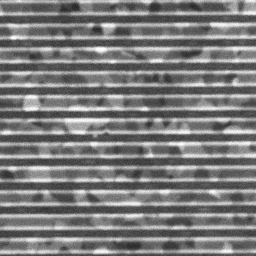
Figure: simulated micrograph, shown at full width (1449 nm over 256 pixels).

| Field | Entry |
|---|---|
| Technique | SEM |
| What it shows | parallel lines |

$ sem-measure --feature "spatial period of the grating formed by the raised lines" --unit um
0.135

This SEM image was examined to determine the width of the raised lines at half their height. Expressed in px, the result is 13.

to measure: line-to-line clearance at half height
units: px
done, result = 10.9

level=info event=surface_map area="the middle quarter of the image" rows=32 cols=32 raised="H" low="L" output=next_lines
LLLLLLLLLLLLLLLLLLLLLLLLLLLLLLLL
LLLLLLLLLLLLLLLLLLLLLLLLLLLLLLLL
HHHHHHHHHHHHHHHHHHHHHHHHHHHHHHHH
HHHHHHHHHHHHHHHHHHHHHHHHHHHHHHHH
HHHHHHHHHHHHHHHHHHHHHHHHHHHHHHHH
LLLLLLLLLLLLLLLLLLLLLLLLLLLLLLLL
LLLLLLLLLLLLLLLLLLLLLLLLLLLLLLLL
LLLLLLLLLLLLLLLLLLLLLLLLLLLLLLLL
HHHHHHHHHHHHHHHHHHHHHHHHHHHHHHHH
HHHHHHHHHHHHHHHHHHHHHHHHHHHHHHHH
HHHHHHHHHHHHHHHHHHHHHHHHHHHHHHHH
LLLLLLLLLLLLLLLLLLLLLLLLLLLLLLLL
LLLLLLLLLLLLLLLLLLLLLLLLLLLLLLLL
LLLLLLLLLLLLLLLLLLLLLLLLLLLLLLLL
HHHHHHHHHHHHHHHHHHHHHHHHHHHHHHHH
HHHHHHHHHHHHHHHHHHHHHHHHHHHHHHHH
HHHHHHHHHHHHHHHHHHHHHHHHHHHHHHHH
LLLLLLLLLLLLLLLLLLLLLLLLLLLLLLLL
LLLLLLLLLLLLLLLLLLLLLLLLLLLLLLLL
LLLLLLLLLLLLLLLLLLLLLLLLLLLLLLLL
HHHHHHHHHHHHHHHHHHHHHHHHHHHHHHHH
HHHHHHHHHHHHHHHHHHHHHHHHHHHHHHHH
HHHHHHHHHHHHHHHHHHHHHHHHHHHHHHHH
LLLLLLLLLLLLLLLLLLLLLLLLLLLLLLLL
LLLLLLLLLLLLLLLLLLLLLLLLLLLLLLLL
LLLLLLLLLLLLLLLLLLLLLLLLLLLLLLLL
HHHHHHHHHHHHHHHHHHHHHHHHHHHHHHHH
HHHHHHHHHHHHHHHHHHHHHHHHHHHHHHHH
HHHHHHHHHHHHHHHHHHHHHHHHHHHHHHHH
LLLLLLLLLLLLLLLLLLLLLLLLLLLLLLLL
LLLLLLLLLLLLLLLLLLLLLLLLLLLLLLLL
LLLLLLLLLLLLLLLLLLLLLLLLLLLLLLLL